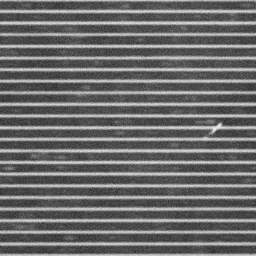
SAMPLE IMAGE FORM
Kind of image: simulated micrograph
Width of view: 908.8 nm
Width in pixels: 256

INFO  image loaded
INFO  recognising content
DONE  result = parallel lines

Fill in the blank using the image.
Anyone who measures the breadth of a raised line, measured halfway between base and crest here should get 6.7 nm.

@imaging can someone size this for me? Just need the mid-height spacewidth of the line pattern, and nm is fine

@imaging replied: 33.3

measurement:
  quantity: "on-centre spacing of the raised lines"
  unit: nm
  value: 41.3